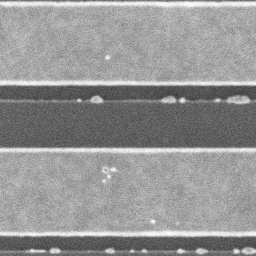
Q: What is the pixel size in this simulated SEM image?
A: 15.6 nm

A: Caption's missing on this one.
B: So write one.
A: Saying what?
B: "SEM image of lines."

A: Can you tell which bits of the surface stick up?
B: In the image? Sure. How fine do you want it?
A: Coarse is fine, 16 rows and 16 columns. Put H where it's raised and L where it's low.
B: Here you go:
HHHHHHHHHHHHHHHH
HHHHHHHHHHHHHHHH
HHHHHHHHHHHHHHHH
HHHHHHHHHHHHHHHH
HHHHHHHHHHHHHHHH
LLLLLLLLLLLLLLLL
LLLLLLLLLLLLLLLL
LLLLLLLLLLLLLLLL
LLLLLLLLLLLLLLLL
HHHHHHHHHHHHHHHH
HHHHHHHHHHHHHHHH
HHHHHHHHHHHHHHHH
HHHHHHHHHHHHHHHH
HHHHHHHHHHHHHHHH
HHHHHHHHHHHHHHHH
LLLLLLLLLLLLLLLL